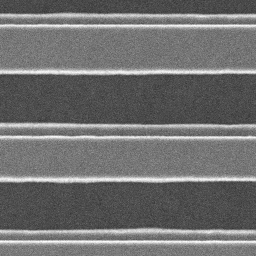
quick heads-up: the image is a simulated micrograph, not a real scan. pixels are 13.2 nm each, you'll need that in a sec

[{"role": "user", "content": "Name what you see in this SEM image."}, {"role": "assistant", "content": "lines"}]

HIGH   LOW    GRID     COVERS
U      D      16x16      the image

DDDDDDDDDDDDDDDD
UUUUUUUUUUUUUUUU
UUUUUUUUUUUUUUUU
UUUUUUUUUUUUUUUU
UUUUUUUUUUUUUUUU
DDDDDDDDDDDDDDDD
DDDDDDDDDDDDDDDD
DDDDDDDDDDDDDDDD
UUUUUUUUUUUUUUUU
UUUUUUUUUUUUUUUU
UUUUUUUUUUUUUUUU
DDDDDDDDDDDDDDDD
DDDDDDDDDDDDDDDD
DDDDDDDDDDDDDDDD
UUUUUUUUUUUUUUDD
UUUUUUUUUUUUUUUU